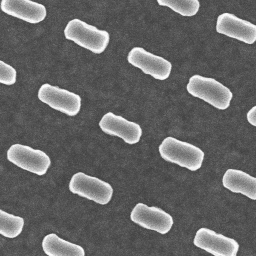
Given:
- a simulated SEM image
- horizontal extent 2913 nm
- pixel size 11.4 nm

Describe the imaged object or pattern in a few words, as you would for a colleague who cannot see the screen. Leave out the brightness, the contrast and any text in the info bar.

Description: a regular array of raised bodies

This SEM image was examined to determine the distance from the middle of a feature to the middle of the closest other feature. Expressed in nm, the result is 764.